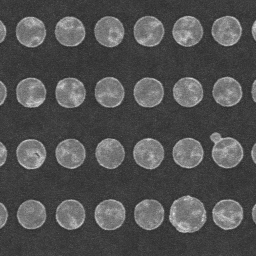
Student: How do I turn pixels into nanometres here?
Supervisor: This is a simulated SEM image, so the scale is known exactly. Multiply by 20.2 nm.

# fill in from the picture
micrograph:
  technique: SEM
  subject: a regular array of raised bodies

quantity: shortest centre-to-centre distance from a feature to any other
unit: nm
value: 789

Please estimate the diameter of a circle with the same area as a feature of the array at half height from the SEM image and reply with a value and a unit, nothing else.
0.595 µm